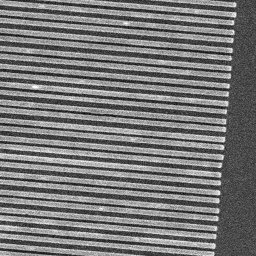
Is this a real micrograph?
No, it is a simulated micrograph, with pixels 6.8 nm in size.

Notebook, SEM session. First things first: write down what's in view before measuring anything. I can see parallel lines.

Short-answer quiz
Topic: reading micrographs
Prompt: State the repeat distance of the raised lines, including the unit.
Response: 60.8 nm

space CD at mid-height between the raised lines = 3.49 pixels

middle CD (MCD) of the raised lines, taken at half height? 33 nm